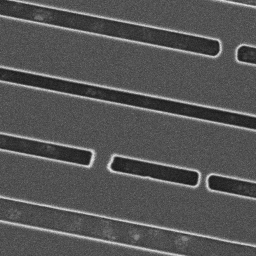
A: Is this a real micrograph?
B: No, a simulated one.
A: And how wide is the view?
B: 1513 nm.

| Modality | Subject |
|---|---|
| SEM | one or a few lines or trenches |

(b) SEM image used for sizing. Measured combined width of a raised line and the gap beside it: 382 nanometres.